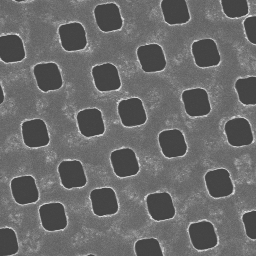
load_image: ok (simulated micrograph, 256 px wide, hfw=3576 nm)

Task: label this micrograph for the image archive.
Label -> a regular array of holes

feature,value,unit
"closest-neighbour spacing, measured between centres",637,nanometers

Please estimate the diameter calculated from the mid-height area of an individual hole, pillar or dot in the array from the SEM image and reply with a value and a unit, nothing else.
0.396 micrometres